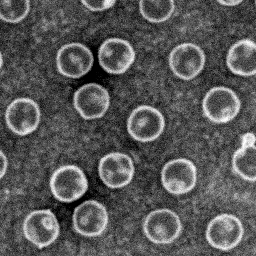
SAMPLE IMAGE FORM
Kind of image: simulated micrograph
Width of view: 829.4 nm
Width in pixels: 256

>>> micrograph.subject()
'a regular array of raised bodies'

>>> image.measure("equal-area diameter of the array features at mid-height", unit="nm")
113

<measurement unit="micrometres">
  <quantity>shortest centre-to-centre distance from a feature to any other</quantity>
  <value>0.166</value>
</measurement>